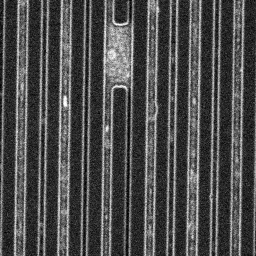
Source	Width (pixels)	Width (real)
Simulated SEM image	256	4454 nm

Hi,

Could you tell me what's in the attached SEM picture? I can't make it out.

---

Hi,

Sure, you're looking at parallel lines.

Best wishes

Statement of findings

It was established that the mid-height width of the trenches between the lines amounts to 128 nanometres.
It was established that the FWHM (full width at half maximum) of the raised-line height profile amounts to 0.259 um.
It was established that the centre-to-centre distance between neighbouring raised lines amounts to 21.6 px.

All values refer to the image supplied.